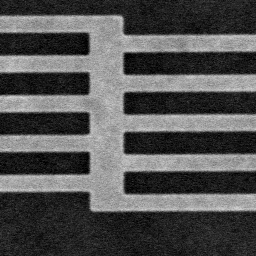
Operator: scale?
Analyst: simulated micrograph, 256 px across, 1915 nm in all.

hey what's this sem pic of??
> groups of lines, slits or small figures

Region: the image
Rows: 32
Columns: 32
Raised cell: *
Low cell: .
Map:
................................
................................
***************.................
***************.................
...........*****....************
...........*********************
...........*****................
***************.................
***************.................
...........*********************
...........*********************
...........*****................
***************.................
***************.................
...........*********************
...........*********************
...........*****................
***************.................
***************.................
...........*********************
...........*********************
...........*****................
***************.................
***************.................
...........*********************
...........*********************
................................
................................
................................
................................
................................
................................